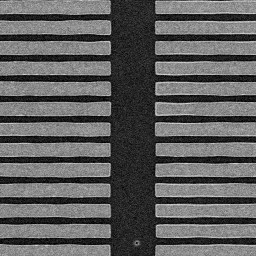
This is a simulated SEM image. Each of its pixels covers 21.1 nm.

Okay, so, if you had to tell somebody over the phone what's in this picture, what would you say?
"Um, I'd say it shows groups of lines, slits or small figures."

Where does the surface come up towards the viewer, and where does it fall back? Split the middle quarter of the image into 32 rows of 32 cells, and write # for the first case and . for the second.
###########............#########
###########............#########
###########..............#######
................................
................................
###########............#########
############...........#########
############....................
................................
................................
############...........#########
###########............#########
###########............#########
................................
................................
###########............#########
###########............#########
###########............#########
................................
................................
###########............#########
###########............#########
###########............#########
................................
................................
###########............#########
###########............#########
###########............#########
................................
................................
###########............#########
###########............#########